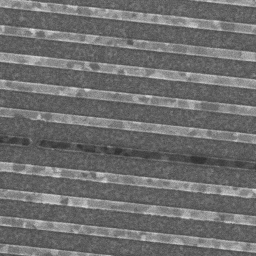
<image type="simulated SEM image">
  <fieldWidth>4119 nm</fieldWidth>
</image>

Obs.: parallel lines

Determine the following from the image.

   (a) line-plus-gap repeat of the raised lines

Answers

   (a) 437 nanometres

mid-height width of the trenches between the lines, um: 0.302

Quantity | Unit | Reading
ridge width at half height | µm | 0.136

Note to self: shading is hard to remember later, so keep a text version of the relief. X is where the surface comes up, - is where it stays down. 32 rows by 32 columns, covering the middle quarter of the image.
XXXXXXXXXXXXXX------------------
-----XXXXXXXXXXXXXXXXXXX--------
--------------XXXXXXXXXXXXXXXXXX
------------------------XXXXXXXX
--------------------------------
--------------------------------
XXXXXX--------------------------
XXXXXXXXXXXXXXXX----------------
-------XXXXXXXXXXXXXXXXXX-------
----------------XXXXXXXXXXXXXXXX
-------------------------XXXXXXX
--------------------------------
--------------------------------
XXXXXXXX------------------------
XXXXXXXXXXXXXXXXX---------------
--------XXXXXXXXXXXXXXXXXX------
-----------------XXXXXXXXXXXXXXX
---------------------------XXXXX
--------------------------------
--------------------------------
XXXXXXXXX-----------------------
XXXXXXXXXXXXXXXXXXX-------------
----------XXXXXXXXXXXXXXXXXX----
-------------------XXXXXXXXXXXXX
----------------------------XXXX
--------------------------------
X-------------------------------
XXXXXXXXXXX---------------------
--X-XXXXXXXXXXXXXXXX------------
-----------XXXXXXXXXXXXXXXXXX---
--------------------XXXXXXXXXXXX
------------------------------XX